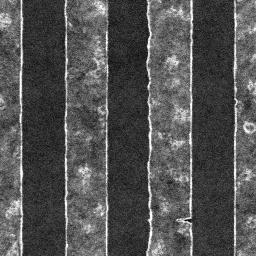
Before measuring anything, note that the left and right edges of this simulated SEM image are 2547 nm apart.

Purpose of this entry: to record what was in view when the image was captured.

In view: one or a few lines or trenches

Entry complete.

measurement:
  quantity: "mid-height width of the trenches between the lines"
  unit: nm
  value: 429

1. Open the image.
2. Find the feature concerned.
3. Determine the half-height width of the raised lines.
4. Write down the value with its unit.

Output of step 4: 412 nanometers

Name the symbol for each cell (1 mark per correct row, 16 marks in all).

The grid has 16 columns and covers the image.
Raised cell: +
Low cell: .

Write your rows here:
+...+++..+++...+
+...+++..+++...+
+...+++..+++...+
+...+++..+++...+
+...+++..+++...+
+...+++..+++...+
+...+++..+++...+
+...+++..+++...+
+...+++..+++...+
+...+++..+++...+
+...+++..+++...+
+...+++..+++...+
+...+++..+++...+
+...+++..+++...+
+...+++..+++...+
+...+++..+++...+